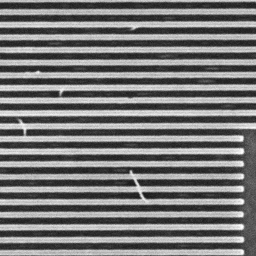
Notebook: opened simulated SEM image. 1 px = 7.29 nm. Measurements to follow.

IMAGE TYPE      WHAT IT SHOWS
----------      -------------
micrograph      parallel lines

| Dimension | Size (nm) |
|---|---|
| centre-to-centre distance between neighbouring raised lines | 92.3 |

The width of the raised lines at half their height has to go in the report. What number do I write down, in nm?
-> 34.6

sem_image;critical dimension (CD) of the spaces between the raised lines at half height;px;7.5